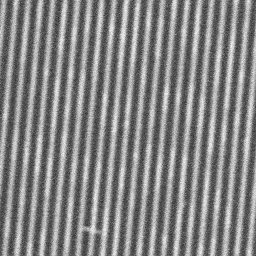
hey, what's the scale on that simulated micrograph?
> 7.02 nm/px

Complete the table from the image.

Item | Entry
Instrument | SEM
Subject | parallel lines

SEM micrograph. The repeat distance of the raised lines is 12.2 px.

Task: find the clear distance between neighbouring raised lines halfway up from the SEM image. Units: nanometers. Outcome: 58.5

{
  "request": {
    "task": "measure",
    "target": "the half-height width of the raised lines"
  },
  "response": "25.3 nanometres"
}